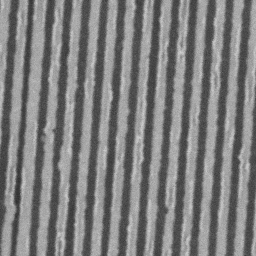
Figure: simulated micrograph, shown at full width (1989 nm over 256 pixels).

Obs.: parallel lines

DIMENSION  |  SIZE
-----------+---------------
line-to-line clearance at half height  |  67.8 nm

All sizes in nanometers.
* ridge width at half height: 67.8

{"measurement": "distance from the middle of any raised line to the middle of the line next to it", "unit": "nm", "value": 139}